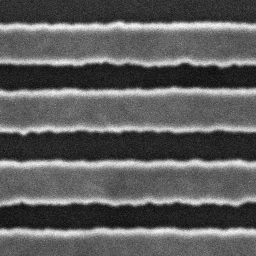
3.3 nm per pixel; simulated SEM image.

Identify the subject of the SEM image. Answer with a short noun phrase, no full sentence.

lines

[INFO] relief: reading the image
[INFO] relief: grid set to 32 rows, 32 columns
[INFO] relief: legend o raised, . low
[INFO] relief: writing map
................................
................................
................................
oooooooooooooooooooooooooooooooo
oooooooooooooooooooooooooooooooo
oooooooooooooooooooooooooooooooo
oooooooooooooooooooooooooooooooo
oooooooooooooooooooooooooooooooo
................................
................................
................................
oooooooooooooooooooooooooooooooo
oooooooooooooooooooooooooooooooo
oooooooooooooooooooooooooooooooo
oooooooooooooooooooooooooooooooo
oooooooooooooooooooooooooooooooo
ooooo.................o.........
................................
................................
................................
oooooooooooooooooooooooooooooooo
oooooooooooooooooooooooooooooooo
oooooooooooooooooooooooooooooooo
oooooooooooooooooooooooooooooooo
oooooooooooooooooooooooooooooooo
oo.....o......oooo......o...oo..
................................
................................
................................
oooooooooooooooooooooooooooooooo
oooooooooooooooooooooooooooooooo
oooooooooooooooooooooooooooooooo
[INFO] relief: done